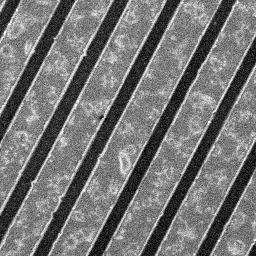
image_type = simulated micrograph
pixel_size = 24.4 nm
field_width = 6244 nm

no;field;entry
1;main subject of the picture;parallel lines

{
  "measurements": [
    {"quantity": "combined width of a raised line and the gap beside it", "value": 1160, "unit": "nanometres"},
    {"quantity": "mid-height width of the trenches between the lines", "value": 14.5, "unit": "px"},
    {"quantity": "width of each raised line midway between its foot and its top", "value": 804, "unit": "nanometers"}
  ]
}